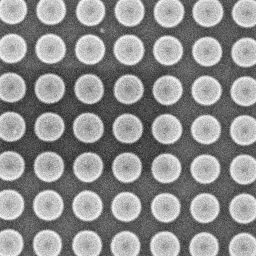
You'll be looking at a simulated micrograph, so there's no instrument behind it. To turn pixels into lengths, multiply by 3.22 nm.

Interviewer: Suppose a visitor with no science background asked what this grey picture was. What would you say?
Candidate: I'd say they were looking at an array of small figures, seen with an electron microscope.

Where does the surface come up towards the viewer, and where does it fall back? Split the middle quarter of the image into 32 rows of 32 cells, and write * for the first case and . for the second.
................................
................................
................................
....*****.....****......****....
...******....******....******...
...*******...*******...******...
...*******...*******..*******...
...*******...*******..*******...
....*****....******....******...
.....***......****......****....
................................
................................
.....**.........................
...******....*****.....*****....
...******....******...*******...
...*******..********..*******...
...*******..********..*******...
...******....******...*******...
...******....******....******...
.....**........**.......***.....
................................
................................
.....***.......**...............
...******....*****.....*****....
...******....******...*******...
...*******..*******...*******...
...******...*******...*******...
...******....******...*******...
....****.....*****.....*****....
...............*................
................................
................................